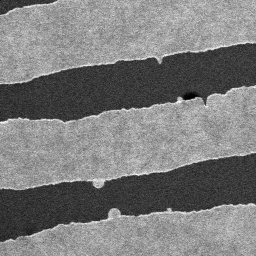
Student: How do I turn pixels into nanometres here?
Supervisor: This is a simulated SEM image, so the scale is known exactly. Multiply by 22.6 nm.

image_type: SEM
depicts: one or a few lines or trenches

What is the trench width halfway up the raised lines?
45.6 pixels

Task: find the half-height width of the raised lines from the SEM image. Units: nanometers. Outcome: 1500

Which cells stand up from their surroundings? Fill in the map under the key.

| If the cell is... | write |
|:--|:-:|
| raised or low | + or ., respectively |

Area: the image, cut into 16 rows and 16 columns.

.+++++++++++++++
++++++++++++++++
++++++++++++++++
+++++++++++.....
++++............
...............+
..........++++++
.++..+++++++++++
++++++++++++++++
++++++++++++++++
+++++++++++.....
+++.............
................
.......+++++++++
..++++++++++++++
++++++++++++++++